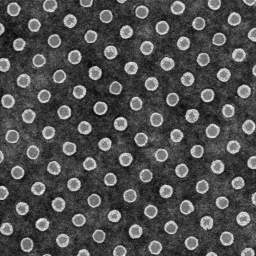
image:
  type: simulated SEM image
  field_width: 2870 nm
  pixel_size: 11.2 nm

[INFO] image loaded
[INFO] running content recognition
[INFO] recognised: a regular array of raised bodies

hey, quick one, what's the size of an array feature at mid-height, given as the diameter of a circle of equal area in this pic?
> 136 nm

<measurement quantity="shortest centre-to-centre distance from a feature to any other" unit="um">0.283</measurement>